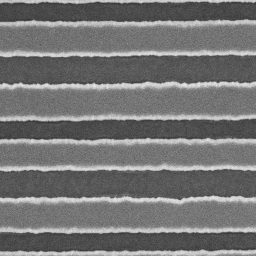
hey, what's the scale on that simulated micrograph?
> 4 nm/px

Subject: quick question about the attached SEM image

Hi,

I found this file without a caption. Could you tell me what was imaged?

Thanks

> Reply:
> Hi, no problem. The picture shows lines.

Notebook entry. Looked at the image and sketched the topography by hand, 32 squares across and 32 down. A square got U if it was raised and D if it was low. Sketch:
DDDDDDDDDDDDDDDDDDDDDDDDDDDDDDDD
DDDDDDDDDDDDDDDDDDDDDDDDDDDDDDDD
DDDDDDDDDDDDDDDDDDDDDDDDDDDDDDDD
UUUUUUUUUUUUUUUUUUUUUUUUUUUUUUUU
UUUUUUUUUUUUUUUUUUUUUUUUUUUUUUUU
UUUUUUUUUUUUUUUUUUUUUUUUUUUUUUUU
UUUUUUUUUUUUUUUUUUUUUUUUUUUUUUUU
DDDDDDDDDDDDDDDDDDDDDDDDDDDDDDDD
DDDDDDDDDDDDDDDDDDDDDDDDDDDDDDDD
DDDDDDDDDDDDDDDDDDDDDDDDDDDDDDDD
UDUDDDDDUUDUDDUUDUUUUUUUUUUUUUUU
UUUUUUUUUUUUUUUUUUUUUUUUUUUUUUUU
UUUUUUUUUUUUUUUUUUUUUUUUUUUUUUUU
UUUUUUUUUUUUUUUUUUUUUUUUUUUUUUUU
UUUUUUUUUUUUUUUUUUUUUUUUUUUUUUUU
DDDDDDDDDDDDDDDDDDDDDDDDDDDDDDDD
DDDDDDDDDDDDDDDDDDDDDDDDDDDDDDDD
UUUUUDUUUDDDUUDDUUUUUUUUUUUUUUUU
UUUUUUUUUUUUUUUUUUUUUUUUUUUUUUUU
UUUUUUUUUUUUUUUUUUUUUUUUUUUUUUUU
UUUUUUUUUUUUUUUUUUUUUUUUUUUUUUUU
DDDDDDDDDDDDDDDDDDDDDDDDDDDDDDDD
DDDDDDDDDDDDDDDDDDDDDDDDDDDDDDDD
DDDDDDDDDDDDDDDDDDDDDDDDDDDDDDDD
DDDDDDDDDDDDDDDDDDDDDDDDDDDDDDDD
UUUUUUUUUUUUUUUUUUUUUUUUUUUUUUUU
UUUUUUUUUUUUUUUUUUUUUUUUUUUUUUUU
UUUUUUUUUUUUUUUUUUUUUUUUUUUUUUUU
UUUUUUUUUUUUUUUUUUUUUUUUUUUUUUUU
DDDDDDDDDDDDDDDDDDDDDDDDDDDDDDDD
DDDDDDDDDDDDDDDDDDDDDDDDDDDDDDDD
DDDDDDDDDUDUUUDUDUUUDDUUDUDUUUUU